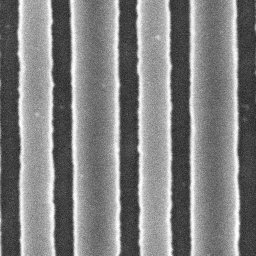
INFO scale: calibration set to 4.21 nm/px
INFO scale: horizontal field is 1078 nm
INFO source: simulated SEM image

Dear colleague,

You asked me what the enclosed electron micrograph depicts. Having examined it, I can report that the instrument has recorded lines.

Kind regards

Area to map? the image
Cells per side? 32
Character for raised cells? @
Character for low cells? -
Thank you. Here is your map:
--@@@@---@@@@@@--@@@@---@@@@@---
--@@@@---@@@@@@--@@@@---@@@@@---
--@@@@---@@@@@@--@@@@---@@@@@---
--@@@@---@@@@@@--@@@@---@@@@@---
--@@@@---@@@@@@--@@@@---@@@@@---
--@@@@---@@@@@@--@@@@---@@@@@---
--@@@@---@@@@@@--@@@@---@@@@@@--
---@@@---@@@@@@--@@@@---@@@@@@--
---@@@---@@@@@@--@@@@---@@@@@@--
--@@@@---@@@@@@--@@@@---@@@@@@--
---@@@@--@@@@@@--@@@@---@@@@@@--
--@@@@---@@@@@@--@@@@---@@@@@@--
--@@@@---@@@@@@--@@@@---@@@@@@--
--@@@@---@@@@@@--@@@@---@@@@@@--
--@@@@---@@@@@@--@@@@---@@@@@@--
--@@@@---@@@@@@--@@@@---@@@@@@--
---@@@---@@@@@@--@@@@---@@@@@@--
---@@@---@@@@@@--@@@@---@@@@@@--
---@@@---@@@@@@--@@@@---@@@@@@--
---@@@---@@@@@@--@@@@---@@@@@@--
---@@@@--@@@@@@--@@@@---@@@@@@--
---@@@@--@@@@@@--@@@@---@@@@@@--
---@@@@--@@@@@@--@@@@---@@@@@@--
---@@@---@@@@@@--@@@@---@@@@@@--
---@@@---@@@@@@--@@@@---@@@@@@--
---@@@@--@@@@@@--@@@@---@@@@@@--
---@@@@--@@@@@@---@@@---@@@@@@--
---@@@@--@@@@@@--@@@@---@@@@@@--
---@@@@--@@@@@@--@@@@---@@@@@@--
---@@@@--@@@@@@---@@@---@@@@@@--
---@@@@--@@@@@@--@@@@---@@@@@@--
---@@@@--@@@@@@---@@@---@@@@@@--